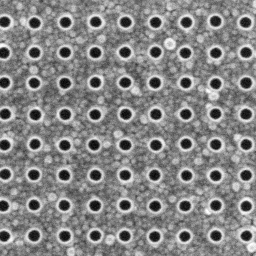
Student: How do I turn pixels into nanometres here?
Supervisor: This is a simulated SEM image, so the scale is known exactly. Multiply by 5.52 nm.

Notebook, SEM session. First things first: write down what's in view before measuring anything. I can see a regular array of holes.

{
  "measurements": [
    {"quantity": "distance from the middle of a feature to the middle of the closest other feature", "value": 165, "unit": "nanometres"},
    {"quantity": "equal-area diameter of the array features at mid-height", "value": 67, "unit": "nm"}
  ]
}